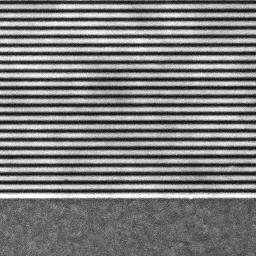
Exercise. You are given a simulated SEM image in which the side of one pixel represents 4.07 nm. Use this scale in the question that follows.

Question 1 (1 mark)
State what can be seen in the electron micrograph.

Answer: parallel lines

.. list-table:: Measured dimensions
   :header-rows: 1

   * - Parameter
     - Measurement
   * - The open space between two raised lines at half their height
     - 19.9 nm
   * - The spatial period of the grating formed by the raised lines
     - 8.57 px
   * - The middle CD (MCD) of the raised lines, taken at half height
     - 15.8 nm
